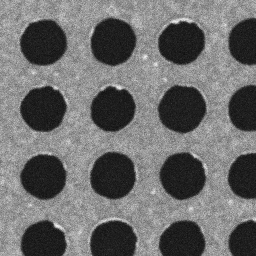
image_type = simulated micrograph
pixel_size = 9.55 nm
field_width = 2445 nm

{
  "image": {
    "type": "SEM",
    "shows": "a regular array of holes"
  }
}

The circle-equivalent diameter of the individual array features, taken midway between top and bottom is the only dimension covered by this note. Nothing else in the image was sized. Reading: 46.9 pixels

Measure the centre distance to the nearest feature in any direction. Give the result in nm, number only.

633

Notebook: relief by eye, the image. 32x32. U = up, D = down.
UUUUUUUUUUUUUUUUUUUUUUUUUUUUUUUU
UUUUUUUUUUUUUUUUUUUUUUUUUUUUUUUU
UUUUUDUUUUUUUDDUUUUUUUUUUUUUUUDD
UUUDDDDDUUUUDDDDDUUUUDDDDUUUUDDD
UUUDDDDDUUUDDDDDDUUUDDDDDDUUUDDD
UUDDDDDDUUUDDDDDDUUUDDDDDDUUUDDD
UUUDDDDDUUUDDDDDDUUUDDDDDUUUUDDD
UUUDDDDUUUUUDDDDUUUUUDDDUUUUUDDD
UUUUUUUUUUUUUUUUUUUUUUUUUUUUUUUU
UUUUUUUUUUUUUUUUUUUUUUUUUUUUUUUU
UUUUUUUUUUUUUUUUUUUUUUUUUUUUUUUU
UUUUDDDDUUUUDDDDUUUUUDDDDUUUUDDD
UUUDDDDDUUUUDDDDDUUUDDDDDDUUUDDD
UUUDDDDDUUUDDDDDDUUUDDDDDDUUDDDD
UUUDDDDDUUUDDDDDDUUUDDDDDDUUUDDD
UUUDDDDDUUUUDDDDUUUUDDDDDUUUUDDD
UUUUUDUUUUUUUDDUUUUUUUDDUUUUUUUU
UUUUUUUUUUUUUUUUUUUUUUUUUUUUUUUU
UUUUUUUUUUUUUUUUUUUUUUUUUUUUUUUU
UUUUDDDUUUUUUDDDUUUUUDDDUUUUUUDD
UUUDDDDDUUUUDDDDDUUUDDDDDUUUUDDD
UUUDDDDDUUUDDDDDDUUUDDDDDDUUUDDD
UUUDDDDDUUUDDDDDDUUUDDDDDDUUDDDD
UUUDDDDDUUUUDDDDDUUUDDDDDUUUUDDD
UUUUDDDUUUUUUDDDUUUUUDDDUUUUUUDD
UUUUUUUUUUUUUUUUUUUUUUUUUUUUUUUU
UUUUUUUUUUUUUUUUUUUUUUUUUUUUUUUU
UUUUUUUUUUUUUUDUUUUUUUUUUUUUUUUU
UUUDDDDUUUUUDDDDDUUUUDDDDUUUUDDD
UUUDDDDDUUUDDDDDDUUUDDDDDUUUUDDD
UUUDDDDDUUUDDDDDDUUUDDDDDDUUDDDD
UUUDDDDDUUUDDDDDDUUUDDDDDUUUUDDD